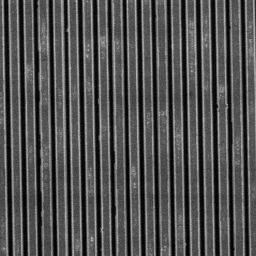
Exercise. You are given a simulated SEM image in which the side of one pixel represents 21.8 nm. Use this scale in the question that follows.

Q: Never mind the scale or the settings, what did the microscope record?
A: parallel lines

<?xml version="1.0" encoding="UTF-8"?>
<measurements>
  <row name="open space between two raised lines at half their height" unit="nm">131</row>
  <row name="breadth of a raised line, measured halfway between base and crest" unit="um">0.196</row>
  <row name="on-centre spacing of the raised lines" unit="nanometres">322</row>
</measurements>